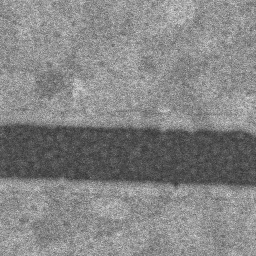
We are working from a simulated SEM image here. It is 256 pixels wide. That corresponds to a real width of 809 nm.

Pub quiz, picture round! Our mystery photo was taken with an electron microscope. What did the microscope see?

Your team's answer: one or a few lines or trenches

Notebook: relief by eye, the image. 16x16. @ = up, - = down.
@@@@@@@@@@@@@@@@
@@@@@@@@@@@@@@@@
@@@@@@@@@@@@@@@@
@@@@@@@@@@@@@@@@
@@@@@@@@@@@@@@@@
@@@@@@@@@@@@@@@@
@@@@@@@@@@@@@@@@
@@@@@@@@@@@@@@@@
----------------
----------------
----------------
@@@@@-----------
@@@@@@@@@@@@@@@@
@@@@@@@@@@@@@@@@
@@@@@@@@@@@@@@@@
@@@@@@@@@@@@@@@@